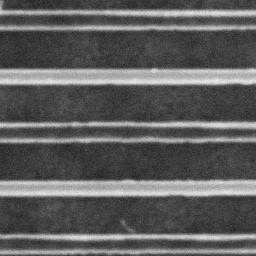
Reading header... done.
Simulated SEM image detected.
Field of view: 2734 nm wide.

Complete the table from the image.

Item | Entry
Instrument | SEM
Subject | lines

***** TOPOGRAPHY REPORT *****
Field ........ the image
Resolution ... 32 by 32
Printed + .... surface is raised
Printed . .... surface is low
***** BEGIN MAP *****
................................
................................
++++++++++++++++++++++++++++++++
++++++++++++++++++++++++++++++++
................................
................................
................................
................................
................................
................................
................................
................................
................................
................................
................................
...........++++++...............
++++++++++++++++++++++++++++++++
++++++++++++++++++++++++++++++++
................................
................................
................................
................................
................................
................................
................................
................................
................................
................................
................................
................................
++++++++++++++++++++++++++++++++
++++++++++++++++++++++++++++++++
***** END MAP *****